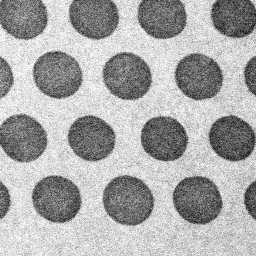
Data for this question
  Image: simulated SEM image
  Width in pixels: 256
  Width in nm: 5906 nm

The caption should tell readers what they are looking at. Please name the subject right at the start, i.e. a regular array of holes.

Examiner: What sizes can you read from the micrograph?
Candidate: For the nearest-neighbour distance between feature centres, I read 1610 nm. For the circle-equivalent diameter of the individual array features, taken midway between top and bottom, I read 1140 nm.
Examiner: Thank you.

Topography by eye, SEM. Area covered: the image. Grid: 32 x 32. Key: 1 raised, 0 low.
00000011100000111000000111100000
00000011100000011000000111000000
00000011100000011000000111000000
00000011100000011100000111100000
10000111110000111110001111110001
11111111111111111111111111111111
11111100111111111111111111111111
01111000001110000011111000011110
01110000001110000001110000001110
00110000001110000001110000001100
00110000001110000001110000001110
01111000001111000011111000011110
11111111111111100111111100111111
11111111111111111111111111111111
10001111110011111111011111110011
00000111100000111100000111100001
00000011000000111100000111000000
00000011000000011100000011000000
00000011100000111100000111000000
10000111110000111110000111100001
11111111111111111111111111111111
11111111111111111111111111111111
11111000011111000011111000111111
01110000001110000001110000011110
01110000001110000001110000001100
01110000001110000001110000001110
01111000001110000001110000001110
11111100011111000011111000011111
11111111111111111111111111111111
11111111111111111111111111111111
11111111111111111111111111111111
11111111111111111111111111111111